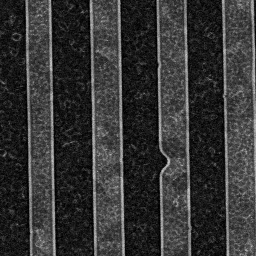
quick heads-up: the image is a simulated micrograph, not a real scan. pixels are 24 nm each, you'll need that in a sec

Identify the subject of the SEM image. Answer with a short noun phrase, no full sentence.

one or a few lines or trenches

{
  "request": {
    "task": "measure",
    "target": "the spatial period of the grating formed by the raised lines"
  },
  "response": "66.7 px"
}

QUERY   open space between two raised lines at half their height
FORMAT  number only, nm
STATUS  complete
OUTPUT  923